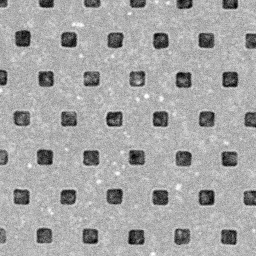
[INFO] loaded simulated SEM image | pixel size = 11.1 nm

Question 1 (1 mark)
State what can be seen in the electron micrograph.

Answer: a regular array of holes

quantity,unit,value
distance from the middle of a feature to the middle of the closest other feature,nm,499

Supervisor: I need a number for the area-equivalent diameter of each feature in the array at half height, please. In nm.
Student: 199